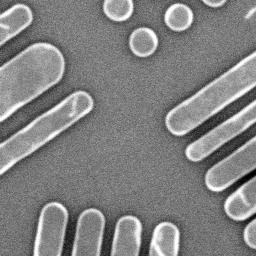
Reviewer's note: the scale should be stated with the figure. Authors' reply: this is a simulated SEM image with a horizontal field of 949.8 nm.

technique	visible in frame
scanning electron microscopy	groups of lines, slits or small figures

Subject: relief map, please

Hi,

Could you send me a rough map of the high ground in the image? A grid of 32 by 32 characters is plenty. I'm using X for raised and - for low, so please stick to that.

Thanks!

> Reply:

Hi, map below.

-------------XXX----------XX----
-XXX---------XXX-----XXX--------
XXXX-----------------XXX--------
XXX------------------XX---------
XX--------------XXX-------------
----------------XXX-------------
---XXXX----------XX-------------
-XXXXXXX-----------------------X
XXXXXXXX---------------------XXX
XXXXXXXX--------------------XXXX
XXXXXXX-------------------XXXXXX
XXXXX--------------------XXXXX--
XXXX----XXX-------------XXXXX---
XX-----XXXX-----------XXXXXX---X
X----XXXXX-----------XXXXX----XX
----XXXXX------------XXXX---XXX-
--XXXXX---------------X---XXXX--
-XXXXX-------------------XXXX---
XXXXX-------------------XXX---XX
XXX---------------------XX---XXX
XX-------------------------XXXXX
--------------------------XXXXX-
--------------------------XXXX-X
--------------------------XX--XX
-----------------------------XXX
------X---------------------XXXX
-----XXX---X----------------XXX-
-----XXX--XXX--XX---------------
-----XXX--XXX--XX---XX---------X
-----XXX-XXXX-XXX--XXX---------X
-----XXX-XXXX-XXX--XXX---------X
-----XXX-XXX--XXX--XXX----------